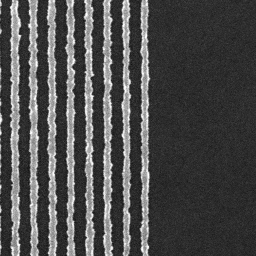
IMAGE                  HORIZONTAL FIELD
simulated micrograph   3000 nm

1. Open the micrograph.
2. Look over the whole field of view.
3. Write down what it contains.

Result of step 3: parallel lines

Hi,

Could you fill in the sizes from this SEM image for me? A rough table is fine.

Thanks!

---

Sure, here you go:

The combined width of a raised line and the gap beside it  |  217 nm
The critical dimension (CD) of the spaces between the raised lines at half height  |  151 nm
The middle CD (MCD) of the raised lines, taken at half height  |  65.9 nm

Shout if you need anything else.